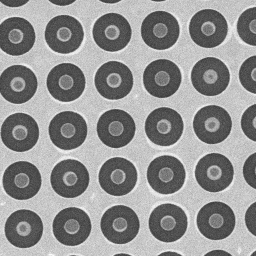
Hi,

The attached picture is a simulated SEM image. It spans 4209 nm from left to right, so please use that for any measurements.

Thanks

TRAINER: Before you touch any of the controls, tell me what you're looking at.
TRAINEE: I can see an array of small figures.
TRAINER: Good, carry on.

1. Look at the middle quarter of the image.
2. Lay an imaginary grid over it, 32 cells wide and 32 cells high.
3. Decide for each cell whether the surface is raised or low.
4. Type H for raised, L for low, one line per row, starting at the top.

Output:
LLLHHHHHHLLLLLLLHHHHHLLLLLLLLHHH
LLLLHHHHLLLLLLLLLHHHLLLLLLLLLHHH
LLLLLHHHLLLLLLLLLHHHLLLHHHLLLLHL
HHLLLHHHLLLHHHLLLHHLLLLHHHLLLLHL
HHLLLLHLLLLHHHLLLHHHLLLHHHLLLHHH
HHLLLHHHLLLLHLLLLHHHLLLLLLLLLHHH
LLLLLHHHLLLLLLLLLHHHLLLLLLLLHHHH
LLLLLHHHHLLLLLLLHHHHHLLLLLLHHHHH
LLLLHHHHHHLLLLLHHHHHHHHLLHHHHHHH
LLHHHHHHHHHHHHHHHHHHHHHHHHHHHHHH
HHHHHHHHHHHHHHHHHHHHHHHHHHHHHHHH
HHHHHHHHHHHLLLHHHHHHHHLLLLLLHHHH
LLLLHHHHHLLLLLLLHHHHHLLLLLLLLHHH
LLLLLHHHHLLLLLLLLHHHHLLLLLLLLLHH
LLLLLLHHLLLLHHLLLLHHLLLLHHLLLLHH
HHLLLLHHLLLHHHHLLLHHLLLHHHLLLLHH
HHHLLLHHLLLHHHHLLLHHLLLLHHLLLLHH
HHLLLLHHLLLLHHLLLLHHHLLLLLLLLLHH
LLLLLHHHHLLLLLLLLHHHHLLLLLLLLHHH
LLLLLHHHHHLLLLLLLHHHHLLLLLLLHHHH
LLLLHHHHHHHLLLLHHHHHHHHLLLLHHHHH
LLHHHHHHHHHHHHHHHHHHHHHHHHHHHHHH
HHHHHHHHHHHHHHHHHHHHHHHHLLHHHHHH
LLHHHHHHHHHHLLLHHHHHHHHLLLLLHHHH
LLLLHHHHHHLLLLLLLHHHHHLLLLLLLHHH
LLLLLHHHHLLLLLLLLLHHHLLLLLLLLLHH
LLLLLLHHHLLLLHLLLLHHHLLLHHHLLLHH
LHHLLLHHHLLLHHHLLLLHLLLLHHHLLLLH
HHHLLLLHLLLLHHHLLLLHHLLLHHHLLLLH
HHHLLLHHHLLLHHHLLLHHHLLLLLLLLLHH
LLLLLLHHHLLLLLLLLLHHHLLLLLLLLLHH
LLLLLLHHHHLLLLLLLHHHHHLLLLLLLHHH